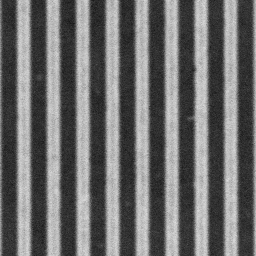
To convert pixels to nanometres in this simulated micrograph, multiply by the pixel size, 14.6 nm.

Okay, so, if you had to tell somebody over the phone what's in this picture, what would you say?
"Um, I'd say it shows parallel lines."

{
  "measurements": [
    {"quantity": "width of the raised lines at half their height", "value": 135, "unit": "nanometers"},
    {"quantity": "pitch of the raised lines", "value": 431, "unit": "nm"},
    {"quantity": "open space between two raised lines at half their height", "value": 297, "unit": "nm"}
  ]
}